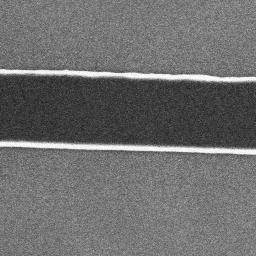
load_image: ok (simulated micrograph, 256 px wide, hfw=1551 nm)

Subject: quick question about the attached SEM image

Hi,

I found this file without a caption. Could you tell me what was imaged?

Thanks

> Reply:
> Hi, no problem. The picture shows one or a few lines or trenches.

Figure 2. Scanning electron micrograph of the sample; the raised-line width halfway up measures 444 nm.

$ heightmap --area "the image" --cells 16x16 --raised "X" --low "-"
----------------
----------------
----------------
----------------
XXX-------------
XXXXXXXXXXXXXXXX
XXXXXXXXXXXXXXXX
XXXXXXXXXXXXXXXX
XXXXXXXXXXXXXXXX
---------------X
----------------
----------------
----------------
----------------
----------------
----------------